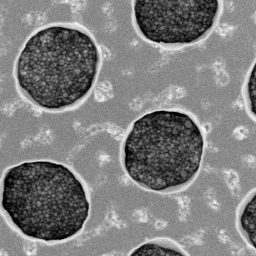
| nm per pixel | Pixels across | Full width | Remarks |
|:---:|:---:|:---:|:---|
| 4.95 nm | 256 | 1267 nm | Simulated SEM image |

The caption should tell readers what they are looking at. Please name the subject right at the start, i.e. holes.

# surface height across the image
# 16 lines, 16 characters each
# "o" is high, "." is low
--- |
oooooooo......oo
ooooooooo....ooo
oo....ooo...oooo
o.....oooooooooo
o.....oooooooooo
o.....ooooooooo.
oo...ooooooooooo
ooooooooo...oooo
oooooooo.....ooo
oooooooo.....ooo
o...oooo....oooo
.....oooo...oooo
.....ooooooooooo
o....oooooooooo.
o....oooooooooo.
ooooooooo..ooooo